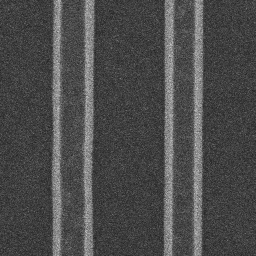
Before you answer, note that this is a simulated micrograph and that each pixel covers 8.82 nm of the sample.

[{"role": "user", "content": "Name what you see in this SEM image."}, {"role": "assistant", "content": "one or a few lines or trenches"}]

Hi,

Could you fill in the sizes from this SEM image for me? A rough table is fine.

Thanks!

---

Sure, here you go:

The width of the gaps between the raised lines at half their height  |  686 nm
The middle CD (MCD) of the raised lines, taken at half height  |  0.289 micrometres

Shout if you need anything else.